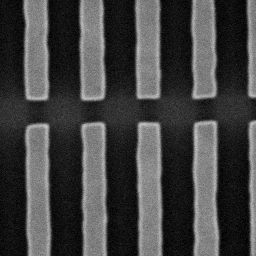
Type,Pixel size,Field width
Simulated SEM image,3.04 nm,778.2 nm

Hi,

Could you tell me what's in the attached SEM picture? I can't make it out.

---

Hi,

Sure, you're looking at groups of lines, slits or small figures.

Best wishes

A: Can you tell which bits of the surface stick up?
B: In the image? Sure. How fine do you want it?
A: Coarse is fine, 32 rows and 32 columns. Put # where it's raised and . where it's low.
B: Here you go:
...###....###....###....###....#
...###....###....###....###....#
...###....###....###....###....#
...###....###....###....###....#
...###....###....###....###....#
...###....###....###....###....#
...###....###....###....###....#
...###....###....###....###....#
...###....###....###....###....#
...###....###....###....###....#
...###....###....###....###....#
...###....###....###....###....#
................................
................................
................................
...........##.....##.....##....#
...###....###....###....###....#
...###....###....###....###....#
...###.....##....###....###....#
...###....###....###....###....#
...###....###....###....###....#
...###....###....###....###....#
...###....###....###....###....#
...###.....##....###....###....#
...###....###....###....###....#
...###....###....###....###....#
...###....###....###....###....#
...###.....##....###....###....#
...###....###....###....###....#
...###.....##....###....###....#
....##.....##....###....###....#
....##.....##....###....###....#